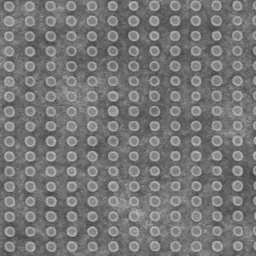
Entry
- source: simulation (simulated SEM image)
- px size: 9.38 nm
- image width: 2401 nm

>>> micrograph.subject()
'a regular array of raised bodies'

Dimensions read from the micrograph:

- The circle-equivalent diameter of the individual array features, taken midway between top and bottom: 91.1 nanometers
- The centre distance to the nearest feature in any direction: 139 nm